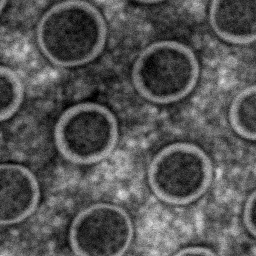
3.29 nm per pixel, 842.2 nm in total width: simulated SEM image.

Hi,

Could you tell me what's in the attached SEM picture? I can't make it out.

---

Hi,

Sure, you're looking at raised bodies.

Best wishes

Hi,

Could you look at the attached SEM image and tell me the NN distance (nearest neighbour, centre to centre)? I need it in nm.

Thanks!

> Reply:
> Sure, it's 331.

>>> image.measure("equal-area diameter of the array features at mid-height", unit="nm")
194